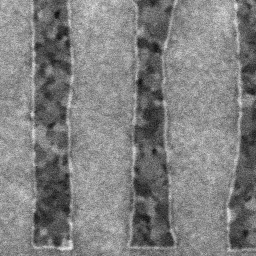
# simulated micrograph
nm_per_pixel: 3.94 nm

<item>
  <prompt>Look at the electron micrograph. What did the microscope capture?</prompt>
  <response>one or a few lines or trenches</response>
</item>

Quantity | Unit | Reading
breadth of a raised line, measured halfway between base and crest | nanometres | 143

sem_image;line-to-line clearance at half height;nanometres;254